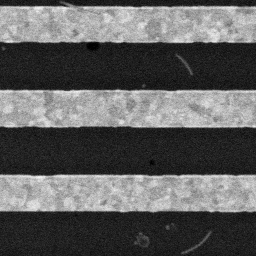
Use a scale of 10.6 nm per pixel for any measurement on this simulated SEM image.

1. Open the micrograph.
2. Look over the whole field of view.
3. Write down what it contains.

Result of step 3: lines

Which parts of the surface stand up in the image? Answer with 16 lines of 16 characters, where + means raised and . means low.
++++++++++++++++
++++++++++++++++
++++++++++++++++
................
................
................
++++++++++++++++
++++++++++++++++
................
................
................
++++++++++++++++
++++++++++++++++
................
................
................